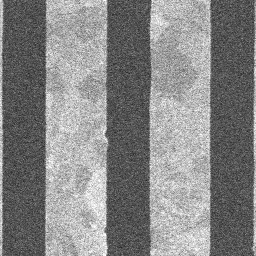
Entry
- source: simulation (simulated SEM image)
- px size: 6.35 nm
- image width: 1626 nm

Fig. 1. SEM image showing one or a few lines or trenches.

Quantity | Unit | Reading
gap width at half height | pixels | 45.1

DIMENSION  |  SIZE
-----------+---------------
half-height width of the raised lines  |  0.374 µm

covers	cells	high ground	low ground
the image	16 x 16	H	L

LLLHHHHLLHHHHLLL
LLLHHHHLLHHHHLLL
LLLHHHHLLHHHHLLL
LLLHHHHLLHHHHLLL
LLLHHHHLLLHHHLLL
LLLHHHHLLHHHHLLL
LLLHHHHLLHHHHLLL
LLLHHHHLLHHHHLLL
LLLHHHHLLHHHHLLL
LLLHHHHLLHHHHLLL
LLLHHHHLLHHHHLLL
LLLHHHHLLHHHHLLL
LLLHHHHLLHHHHLLL
LLLHHHHLLHHHHLLL
LLLHHHHLLHHHHLLL
LLLHHHHLLHHHHLLL